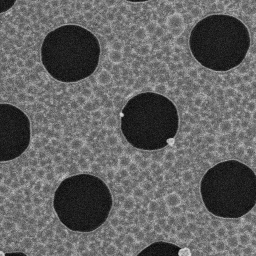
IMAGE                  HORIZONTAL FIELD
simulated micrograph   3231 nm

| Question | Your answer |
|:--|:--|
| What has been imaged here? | holes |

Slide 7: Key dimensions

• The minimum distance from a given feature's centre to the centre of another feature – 1320 nanometres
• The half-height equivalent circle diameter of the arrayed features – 742 nanometers